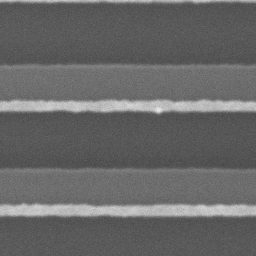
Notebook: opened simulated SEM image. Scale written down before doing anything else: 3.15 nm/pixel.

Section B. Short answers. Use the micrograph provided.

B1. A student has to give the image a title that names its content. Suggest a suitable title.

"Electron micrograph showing lines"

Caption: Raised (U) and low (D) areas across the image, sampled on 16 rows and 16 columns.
DDDDDDDDDDDDDDDD
DDDDDDDDDDDDDDDD
DDDDDDDDDDDDDDDD
DDDDDDDDDDDDDDDD
UUUUUUUUUUUUUUUU
UUUUUUUUUUUUUUUU
UUUUUUUUUUUUUUUU
DDDDDDDDDDDDDDDD
DDDDDDDDDDDDDDDD
DDDDDDDDDDDDDDDD
DDDDDDDDDDDDDDDD
UUUUUUUUUUUUUUUU
UUUUUUUUUUUUUUUU
DDDDDDDDDDDDDDDD
DDDDDDDDDDDDDDDD
DDDDDDDDDDDDDDDD